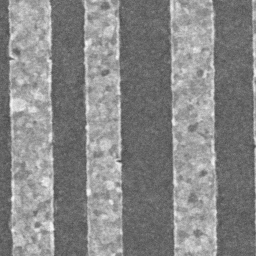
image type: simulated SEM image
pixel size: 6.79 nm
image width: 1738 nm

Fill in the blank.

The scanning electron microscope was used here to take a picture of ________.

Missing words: one or a few lines or trenches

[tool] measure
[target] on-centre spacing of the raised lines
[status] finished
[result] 547 nanometers